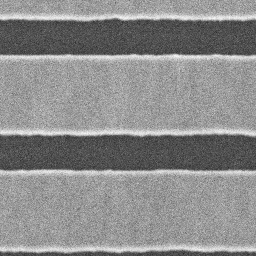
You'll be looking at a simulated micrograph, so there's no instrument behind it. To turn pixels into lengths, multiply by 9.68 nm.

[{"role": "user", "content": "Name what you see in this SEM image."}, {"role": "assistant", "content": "lines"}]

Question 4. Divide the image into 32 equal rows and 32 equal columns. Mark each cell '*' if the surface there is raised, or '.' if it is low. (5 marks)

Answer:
********************************
********************************
................................
................................
................................
................................
................................
********************************
********************************
********************************
********************************
********************************
********************************
********************************
********************************
********************************
********************************
................................
................................
................................
................................
********************************
********************************
********************************
********************************
********************************
********************************
********************************
********************************
********************************
********************************
................................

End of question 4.